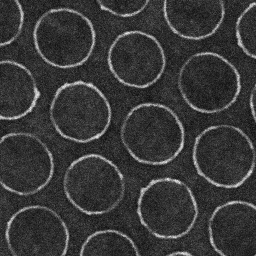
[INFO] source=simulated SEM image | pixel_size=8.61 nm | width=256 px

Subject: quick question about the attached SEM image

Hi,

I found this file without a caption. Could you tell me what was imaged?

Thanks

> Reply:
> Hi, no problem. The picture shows a regular array of raised bodies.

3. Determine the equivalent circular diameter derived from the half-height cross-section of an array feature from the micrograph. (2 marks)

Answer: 516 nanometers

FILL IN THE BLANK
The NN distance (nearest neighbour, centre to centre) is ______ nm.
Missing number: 642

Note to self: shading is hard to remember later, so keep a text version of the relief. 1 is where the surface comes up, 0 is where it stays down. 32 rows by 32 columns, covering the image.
11000000000001111100011111110001
11100011100000111000011111110001
11100111111000000000011111110011
11101111111100000000011111100011
11001111111100011110000111000011
10001111111100111111000000000011
00000111111000111111000000000001
00000011111000111111100011110000
11100000000000111111000111111000
11110000000000111111000111111100
11110000111000001110001111111100
11111001111110000000000111111100
11111001111110000000000111111001
11110011111111000111100011110001
11100011111111001111110000000000
00000001111111001111111000000000
00000001111110011111111001111100
11111000011000011111111011111110
11111100000000001111111011111111
11111100000100000111110011111111
11111110011111000001000011111111
11111110111111100000000001111110
11111100111111100001110000111110
01111000111111100011111000000000
00000000111111100111111100000000
00000000011111000111111110001110
00111110000110000111111110011111
01111111000000000011111100111111
01111111000000000011111100111111
01111111000111110000111000111111
01111111000111111000000000111111
00111111001111111000000000011111